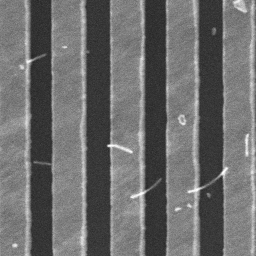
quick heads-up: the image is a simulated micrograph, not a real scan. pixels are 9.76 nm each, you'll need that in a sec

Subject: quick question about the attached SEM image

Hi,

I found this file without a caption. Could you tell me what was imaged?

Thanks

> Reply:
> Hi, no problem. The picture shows lines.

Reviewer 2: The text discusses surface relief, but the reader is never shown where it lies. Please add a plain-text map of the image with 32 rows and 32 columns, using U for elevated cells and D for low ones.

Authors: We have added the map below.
UUUUDDDUUUUDDDUUUUDDDUUUUDDDUUUU
UUUUDDDUUUUDDDUUUUDDDUUUUDDDUUUU
UUUUDDDUUUUDDDUUUUDDDUUUUDDDUUUU
UUUUDDDUUUUDDDUUUUDDDUUUUDDDUUUU
UUUUDDDUUUUDDDUUUUDDDUUUUDDDUUUU
UUUUDDDUUUUDDDUUUUDDDUUUUDDDUUUU
UUUUDDDUUUUDDDUUUUDDDUUUUDDDUUUU
UUUUDDDUUUUDDDUUUUDDDUUUUDDDUUUU
UUUUDDDUUUUDDDUUUUDDDUUUUDDDUUUU
UUUUDDDUUUUDDDUUUUDDDUUUUDDDUUUU
UUUUDDDUUUUDDDUUUUDDDUUUUDDDUUUU
UUUUDDDUUUUDDDUUUUDDDUUUUDDDUUUU
UUUUDDDUUUUDDDUUUUDDDUUUUDDDUUUU
UUUUDDDUUUUDDDUUUUDDDUUUUDDDUUUU
UUUUDDDUUUUDDDUUUUDDDUUUUDDDUUUU
UUUUDDDUUUUDDDUUUUDDDUUUUDDDUUUU
UUUUDDDUUUUDDDUUUUDDDUUUUDDDUUUU
UUUUDDDUUUUDDDUUUUDDDUUUUDDDUUUU
UUUUDDDUUUUDDDUUUUDDDUUUUDDDUUUU
UUUUDDDUUUUDDDUUUUDDDUUUUDDDUUUU
UUUUDDDUUUUDDDUUUUDDDUUUUDDDUUUU
UUUUDDDUUUUDDDUUUUDDDUUUUDDDUUUU
UUUUDDDUUUUDDDUUUUDDDUUUUDDDUUUU
UUUUDDDUUUUDDDUUUUDDDUUUUDDDUUUU
UUUUDDDUUUUDDDUUUUDDDUUUUDDDUUUU
UUUUDDDUUUUDDDUUUUDDDUUUUDDDUUUU
UUUUDDDUUUUDDDUUUUDDDUUUUDDDUUUU
UUUUDDDUUUUDDDUUUUDDDUUUUDDDUUUU
UUUUDDDUUUUDDDUUUUDDDUUUUDDDUUUU
UUUUDDDUUUUDDDUUUUDDDUUUUDDDUUUU
UUUUDDDUUUUDDDUUUUDDDUUUUDDDUUUU
UUUUDDDUUUUDDDUUUUDDDUUUUDDDUUUU